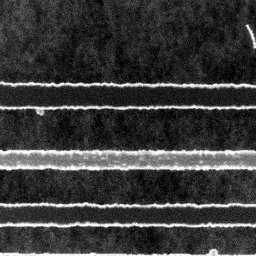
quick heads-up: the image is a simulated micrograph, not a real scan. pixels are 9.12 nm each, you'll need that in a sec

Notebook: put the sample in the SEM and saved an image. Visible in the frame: lines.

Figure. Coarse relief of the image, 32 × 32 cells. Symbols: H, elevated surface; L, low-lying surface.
LLLLLLLLLLLLLLLLLLLLLLLLLLLLLLLL
LLLLLLLLLLLLLLLLLLLLLLLLLLLLLLLL
LLLLLLLLLLLLLLLLLLLLLLLLLLLLLLLL
LLLLLLLLLLLLLLLLLLLLLLLLLLLLLLLL
LLLLLLLLLLLLLLLLLLLLLLLLLLLLLLLL
LLLLLLLLLLLLLLLLLLLLLLLLLLLLLLLL
LLLLLLLLLLLLLLLLLLLLLLLLLLLLLLLL
LLLLLLLLLLLLLLLLLLLLLLLLLLLLLLLL
LLLLLLLLLLLLLLLLLLLLLLLLLLLLLLLL
LLLLLLLLLLLLLLLLLLLLLLLLLLLLLLLL
HHHHHHHLHHHHHHLLHHLLLLLLLLLLHLLL
HHHHHHHHHHHHHHHHHHHHHHHHHHHHHHHH
HHHHHHHHHHHHHHHHHHHHHHHHHHHHHHHH
HHHLHHHLLHHLHLHHLHHHLLLLLLHHHHHL
LLLLLLLLLLLLLLLLLLLLLLLLLLLLLLLL
LLLLLLLLLLLLLLLLLLLLLLLLLLLLLLLL
LLLLLLLLLLLLLLLLLLLLLLLLLLLLLLLL
LLLLLLLLLLLLLLLLLLLLLLLLLLLLLLLL
LLLLLLLLLLLLLLLLLLLLLLLLLLLLLLLL
HHHHHHHHHHHHHHHHHHHHHHHHHHHHHHHH
HHHHHHHHHHHHHHHHHHHHHHHHHHHHHHHH
LLLLLLLLLLLLLLLLLLLLLLLLLLLLLLLL
LLLLLLLLLLLLLLLLLLLLLLLLLLLLLLLL
LLLLLLLLLLLLLLLLLLLLLLLLLLLLLLLL
LLLLLLLLLLLLLLLLLLLLLLLLLLLLLLLL
LLLLLHLLLLHLLLLLLLLLLLLLLLLLLLLL
HHHHHHHHHHHHHHHHHHHHHHHHHHHHHHHH
HHHHHHHHHHHHHHHHHHHHHHHHHHHHHHHH
LLLLLLLLLLLLLLLLLLLLLLLLLLLLLLLL
LLLLLLLLLLLLLLLLLLLLLLLLLLLLLLLL
LLLLLLLLLLLLLLLLLLLLLLLLLLLLLLLL
LLLLLLLLLLLLLLLLLLLLLLLLLLLLLLLL